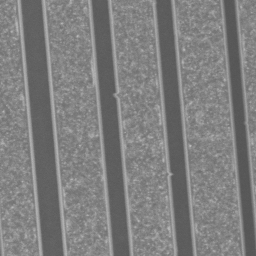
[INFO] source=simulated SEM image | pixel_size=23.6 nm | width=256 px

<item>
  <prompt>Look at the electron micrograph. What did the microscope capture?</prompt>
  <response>one or a few lines or trenches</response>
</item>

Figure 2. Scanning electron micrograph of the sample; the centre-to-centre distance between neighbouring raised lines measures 1.54 microns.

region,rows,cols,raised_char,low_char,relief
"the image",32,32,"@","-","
@@---@@@@@@---@@@@@---@@@@@@--@@
@@@---@@@@@---@@@@@---@@@@@@--@@
@@@---@@@@@---@@@@@@--@@@@@@--@@
@@@---@@@@@@--@@@@@@--@@@@@@--@@
@@@---@@@@@@--@@@@@@--@@@@@@--@@
@@@---@@@@@@--@@@@@@--@@@@@@--@@
@@@---@@@@@@--@@@@@@--@@@@@@--@@
@@@---@@@@@@--@@@@@@--@@@@@@--@@
@@@---@@@@@@--@@@@@@--@@@@@@--@@
@@@---@@@@@@---@@@@@--@@@@@@@-@@
@@@---@@@@@@---@@@@@--@@@@@@@-@@
@@@---@@@@@@---@@@@@---@@@@@@--@
@@@---@@@@@@---@@@@@---@@@@@@--@
@@@@---@@@@@---@@@@@---@@@@@@--@
@@@@---@@@@@---@@@@@@--@@@@@@--@
@@@@---@@@@@@--@@@@@@--@@@@@@--@
@@@@---@@@@@@--@@@@@@--@@@@@@--@
@@@@---@@@@@@--@@@@@@--@@@@@@--@
@@@@---@@@@@@--@@@@@@--@@@@@@--@
@@@@---@@@@@@--@@@@@@--@@@@@@--@
@@@@---@@@@@@--@@@@@@--@@@@@@@-@
@@@@---@@@@@@---@@@@@--@@@@@@@-@
@@@@---@@@@@@---@@@@@---@@@@@@-@
@@@@---@@@@@@---@@@@@---@@@@@@--
@@@@@---@@@@@---@@@@@---@@@@@@--
@@@@@---@@@@@---@@@@@---@@@@@@--
@@@@@---@@@@@---@@@@@@--@@@@@@--
@@@@@---@@@@@@--@@@@@@--@@@@@@--
@@@@@---@@@@@@--@@@@@@--@@@@@@--
@@@@@---@@@@@@--@@@@@@--@@@@@@--
@@@@@---@@@@@@--@@@@@@--@@@@@@--
@@@@@---@@@@@@--@@@@@@--@@@@@@--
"